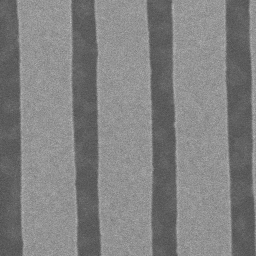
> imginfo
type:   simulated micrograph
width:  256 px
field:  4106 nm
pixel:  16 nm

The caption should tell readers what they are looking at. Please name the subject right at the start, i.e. one or a few lines or trenches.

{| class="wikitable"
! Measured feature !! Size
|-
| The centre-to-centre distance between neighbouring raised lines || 1.24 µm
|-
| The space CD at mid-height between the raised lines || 407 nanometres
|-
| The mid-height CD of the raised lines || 832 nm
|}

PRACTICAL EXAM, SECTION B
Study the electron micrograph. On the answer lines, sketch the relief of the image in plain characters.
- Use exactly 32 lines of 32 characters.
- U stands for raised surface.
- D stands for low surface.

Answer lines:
DDUUUUUUUDDDUUUUUUDDDDUUUUUUDDDU
DDUUUUUUUDDDUUUUUUDDDDUUUUUUDDDU
DDUUUUUUUDDDUUUUUUDDDDUUUUUUDDDU
DDUUUUUUUDDDUUUUUUDDDDUUUUUUDDDU
DDUUUUUUUDDDUUUUUUUDDDUUUUUUDDDU
DDDUUUUUUDDDUUUUUUUDDDUUUUUUDDDU
DDDUUUUUUDDDUUUUUUUDDDUUUUUUDDDU
DDDUUUUUUDDDUUUUUUUDDDUUUUUUDDDU
DDDUUUUUUDDDUUUUUUUDDDUUUUUUDDDD
DDDUUUUUUDDDUUUUUUUDDDUUUUUUDDDD
DDDUUUUUUDDDUUUUUUUDDDUUUUUUDDDD
DDDUUUUUUDDDUUUUUUUDDDUUUUUUDDDD
DDDUUUUUUDDDUUUUUUUDDDUUUUUUDDDD
DDDUUUUUUDDDUUUUUUUDDDUUUUUUDDDD
DDDUUUUUUDDDUUUUUUUDDDUUUUUUDDDD
DDDUUUUUUDDDUUUUUUUDDDUUUUUUDDDD
DDDUUUUUUDDDUUUUUUUDDDUUUUUUDDDD
DDDUUUUUUDDDUUUUUUUDDDUUUUUUDDUD
DDDUUUUUUDDDUUUUUUUDDDUUUUUUDDDD
DDDUUUUUUDDDUUUUUUUDDDUUUUUUDDDD
DDDUUUUUUDDDUUUUUUUDDDUUUUUUUDDD
DDDUUUUUUDDDUUUUUUUDDDUUUUUUUDDD
DDDUUUUUUDDDUUUUUUUDDDUUUUUUUDDD
DDDUUUUUUDDDUUUUUUUDDDUUUUUUUDDD
DDDUUUUUUDDDUUUUUUUDDDUUUUUUUDDD
DDDUUUUUUDDDUUUUUUUDDDUUUUUUUDDD
DDDUUUUUUDDDUUUUUUUDDDUUUUUUUDDD
DDDUUUUUUUDDDUUUUUUDDDUUUUUUUDDD
DDDUUUUUUUDDDUUUUUUDDDUUUUUUUDDD
DDDUUUUUUDDDDUUUUUUDDDUUUUUUUDDD
DDDUUUUUUDDDDUUUUUUDDDUUUUUUUDDD
DDDUUUUUUUDDDUUUUUUDDDUUUUUUUDDD